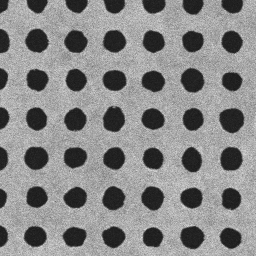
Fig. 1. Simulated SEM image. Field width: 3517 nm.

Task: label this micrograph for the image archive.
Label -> a regular array of holes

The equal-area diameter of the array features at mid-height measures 307 nm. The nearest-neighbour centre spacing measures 0.532 microns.